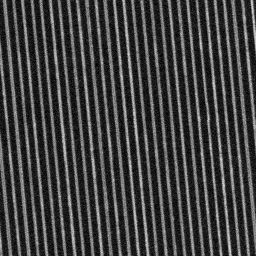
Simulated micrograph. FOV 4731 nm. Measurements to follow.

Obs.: parallel lines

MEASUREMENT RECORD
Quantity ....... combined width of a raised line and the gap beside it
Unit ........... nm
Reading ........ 168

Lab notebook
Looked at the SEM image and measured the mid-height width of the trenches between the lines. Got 129 nm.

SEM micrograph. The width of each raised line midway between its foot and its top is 36.8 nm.